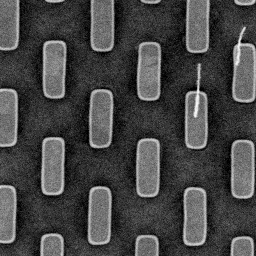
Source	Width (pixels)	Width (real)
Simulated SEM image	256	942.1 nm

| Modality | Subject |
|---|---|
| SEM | groups of lines, slits or small figures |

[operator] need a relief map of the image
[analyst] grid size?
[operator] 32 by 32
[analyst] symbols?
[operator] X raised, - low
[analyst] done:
XX---------XXX---------XXX------
XX---------XXX---------XXX------
XX----------XX---------XXX------
XX---------XXX---------XXX------
XX---------XXX---------XXX------
XX----XX---XXX----XX---XXX------
------XX---------XXX---------XXX
------XX---------XXX---------XXX
------XX---------XXX---------XXX
------XX---------XXX---------XXX
------XX---------XXX---------XXX
XX----XX----XX---XXX----X----XXX
XX---------XXX---------XXX----X-
XX---------XXX---------XXX------
XX---------XXX---------XXX------
XX---------XXX---------XXX------
XX---------XXX---------XXX------
XX----XX---XXX----X----XXX------
-----XXX---------XXX---------XXX
-----XXX---------XXX---------XXX
-----XXX---------XXX---------XXX
-----XXX---------XXX---------XXX
-----XXX---------XXX---------XXX
XX---XXX----X----XXX---------XXX
XX---------XXX---------XXX----X-
XX---------XXX---------XXX------
XX---------XXX---------XXX------
XX---------XXX---------XXX------
XX---------XXX---------XXX------
XX----X----XXX---------XXX------
-----XXX---------XXX----X----XXX
-----XXX---------XXX---------XXX